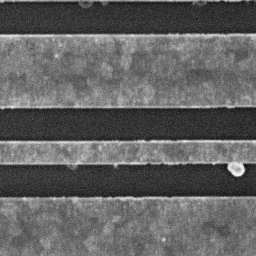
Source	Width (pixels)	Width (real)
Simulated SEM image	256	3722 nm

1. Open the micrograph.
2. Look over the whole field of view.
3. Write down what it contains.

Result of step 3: lines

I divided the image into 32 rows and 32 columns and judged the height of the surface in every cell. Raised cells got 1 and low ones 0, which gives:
00000000001000000000000000000000
00000000000000000000000000000000
00000000000000000000000000000000
00000000000000000000000000000000
00000000000000000000000111111111
11111111111111111111111111111111
11111111111111111111111111111111
11111111111111111111111111111111
11111111111111111111111111111111
11111111111111111111111111111111
11111111111111111111111111111111
11111111111111111111111111111111
11111111111111111111111111111111
10000000000000000000000000000000
00000000000000000000000000000000
00000000000000000000000000000000
00000000000000000000000000000000
00000000000000000000000000000000
11111111111111111111111111111111
11111111111111111111111111111111
00000000010000000000000000001110
00000000000000000000000000000100
00000000000000000000000000000000
00000000000000000000000000000000
00000000000000000000000000000000
11111111111111111111111111111111
11111111111111111111111111111111
11111111111111111111111111111111
11111111111111111111111111111111
11111111111111111111111111111111
11111111111111111111111111111111
11111111111111111111111111111111